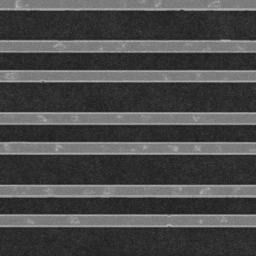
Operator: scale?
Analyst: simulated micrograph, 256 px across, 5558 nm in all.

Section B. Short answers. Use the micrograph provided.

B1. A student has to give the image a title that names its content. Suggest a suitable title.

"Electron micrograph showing parallel lines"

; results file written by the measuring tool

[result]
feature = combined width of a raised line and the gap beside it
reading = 757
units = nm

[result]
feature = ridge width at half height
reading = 228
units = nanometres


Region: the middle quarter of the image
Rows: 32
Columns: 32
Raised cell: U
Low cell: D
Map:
DDDDDDDDDDDDDDDDDDDDDDDDDDDDDDDD
DDDDDDDDDDDDDDDDDDDDDDDDDDDDDDDD
UUUUUUUUUUUUUUUUUUUUUUUUUUUUUUUU
UUUUUUUUUUUUUUUUUUUUUUUUUUUUUUUU
DDDDDDDDDDDDDDDDDDDDDDDDDDDDDDDD
DDDDDDDDDDDDDDDDDDDDDDDDDDDDDDDD
DDDDDDDDDDDDDDDDDDDDDDDDDDDDDDDD
DDDDDDDDDDDDDDDDDDDDDDDDDDDDDDDD
DDDDDDDDDDDDDDDDDDDDDDDDDDDDDDDD
DDDDDDDDDDDDDDDDDDDDDDDDDDDDDDDD
DDDDDDDDDDDDDDDDDDDDDDDDDDDDDDDD
DDDDDDDDDDDDDDDDDDDDDDDDDDDDDDDD
UUUUUUUUUUUUUUUUUUUUUUUUUUUUUUUU
UUUUUUUUUUUUUUUUUUUUUUUUUUUUUUUU
UUUUUUUUUUUUUUUUUUUUUUUUUUUUUUUU
DDDDDDDDDDDDDDDDDDDDDDDDDDDDDDDD
DDDDDDDDDDDDDDDDDDDDDDDDDDDDDDDD
DDDDDDDDDDDDDDDDDDDDDDDDDDDDDDDD
DDDDDDDDDDDDDDDDDDDDDDDDDDDDDDDD
DDDDDDDDDDDDDDDDDDDDDDDDDDDDDDDD
UUUUUUUUUUUUUUUUUUUUUUUUUUUUUUUU
UUUUUUUUUUUUUUUUUUUUUUUUUUUUUUUU
DDDDDDDDDDDDDDDDDDDDDDDDDDDDDDDD
DDDDDDDDDDDDDDDDDDDDDDDDDDDDDDDD
DDDDDDDDDDDDDDDDDDDDDDDDDDDDDDDD
DDDDDDDDDDDDDDDDDDDDDDDDDDDDDDDD
DDDDDDDDDDDDDDDDDDDDDDDDDDDDDDDD
DDDDDDDDDDDDDDDDDDDDDDDDDDDDDDDD
DDDDDDDDDDDDDDDDDDDDDDDDDDDDDDDD
DDDDDDDDDDDDDDDDDDDDDDDDDDDDDDDD
UUUUUUUUUUUUUUUUUUUUUUUUUUUUUUUU
UUUUUUUUUUUUUUUUUUUUUUUUUUUUUUUU